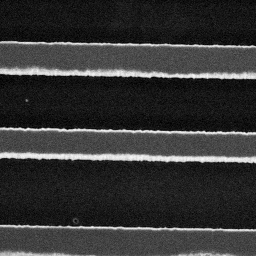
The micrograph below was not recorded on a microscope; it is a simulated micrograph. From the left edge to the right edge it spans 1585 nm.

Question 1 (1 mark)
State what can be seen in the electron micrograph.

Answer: lines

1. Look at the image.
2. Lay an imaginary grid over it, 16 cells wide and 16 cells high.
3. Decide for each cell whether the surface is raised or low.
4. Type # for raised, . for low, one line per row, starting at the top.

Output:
................
................
................
################
################
................
................
................
################
################
................
................
................
................
################
################